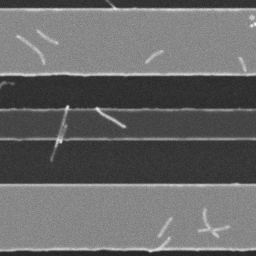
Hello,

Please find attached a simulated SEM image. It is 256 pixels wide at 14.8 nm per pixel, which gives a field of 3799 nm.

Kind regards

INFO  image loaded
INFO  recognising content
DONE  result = lines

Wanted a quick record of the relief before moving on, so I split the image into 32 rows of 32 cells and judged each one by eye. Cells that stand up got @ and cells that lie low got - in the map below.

--------------------------------
@@@@@@@@@@@@@@@@@@@@@@@@@@@@@@@@
@@@@@@@@@@@@@@@@@@@@@@@@@@@@@@@@
@@@@@@@@@@@@@@@@@@@@@@@@@@@@@@@@
@@@@@@@@@@@@@@@@@@@@@@@@@@@@@@@@
@@@@@@@@@@@@@@@@@@@@@@@@@@@@@@@@
@@@@@@@@@@@@@@@@@@@@@@@@@@@@@@@@
@@@@@@@@@@@@@@@@@@@@@@@@@@@@@@@@
@@@@@@@@@@@@@@@@@@@@@@@@@@@@@@@@
--------------------------------
--------------------------------
--------------------------------
--------------------------------
------------@-------------------
@@@@@@@@@@@@@@@@@@@@@@@@@@@@@@@@
@@@@@@@@@@@@@@@@@@@@@@@@@@@@@@@@
@@@@@@@@@@@@@@@@@@@@@@@@@@@@@@@@
-------@------------------------
--------------------------------
--------------------------------
--------------------------------
--------------------------------
--------------------------------
@@@@@@@@@@@@@@@@@@@@@@@@@@@@@@@@
@@@@@@@@@@@@@@@@@@@@@@@@@@@@@@@@
@@@@@@@@@@@@@@@@@@@@@@@@@@@@@@@@
@@@@@@@@@@@@@@@@@@@@@@@@@@@@@@@@
@@@@@@@@@@@@@@@@@@@@@@@@@@@@@@@@
@@@@@@@@@@@@@@@@@@@@@@@@@@@@@@@@
@@@@@@@@@@@@@@@@@@@@@@@@@@@@@@@@
@@@@@@@@@@@@@@@@@@@@@@@@@@@@@@@@
--------------------------------